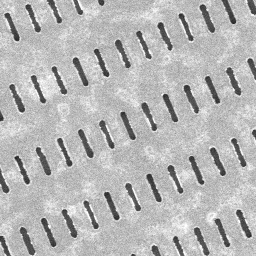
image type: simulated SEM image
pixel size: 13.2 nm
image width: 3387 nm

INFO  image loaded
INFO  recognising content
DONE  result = a regular array of holes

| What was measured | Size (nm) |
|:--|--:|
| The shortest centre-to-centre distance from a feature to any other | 302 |